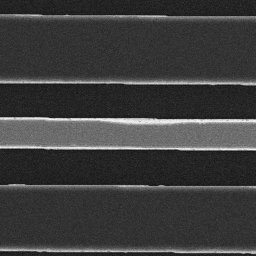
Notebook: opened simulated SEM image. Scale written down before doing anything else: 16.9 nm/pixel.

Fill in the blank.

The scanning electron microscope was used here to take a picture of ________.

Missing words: lines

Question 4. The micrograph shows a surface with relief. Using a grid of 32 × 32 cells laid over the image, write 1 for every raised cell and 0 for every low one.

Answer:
00000000000000000000000000000000
00000000000000000000000000000000
11111111111111111111111111111111
11111111111111111111111111111111
11111111111111111111111111111111
11111111111111111111111111111111
11111111111111111111111111111111
11111111111111111111111111111111
11111111111111111111111111111111
11111111111111111111111111111111
00000000000000000000000000000001
00000000000000000000000000000000
00000000000000000000000000000000
00000000000000000000000000000000
00000000000000000000000000000000
11111111111111111111111111111111
11111111111111111111111111111111
11111111111111111111111111111111
00000000000111111111111111111111
00000000000000000000000000000000
00000000000000000000000000000000
00000000000000000000000000000000
00000000000000000000000000000000
11111111111111111111111111111111
11111111111111111111111111111111
11111111111111111111111111111111
11111111111111111111111111111111
11111111111111111111111111111111
11111111111111111111111111111111
11111111111111111111111111111111
11111111111111111111111111111111
00000000000000000000001111111111